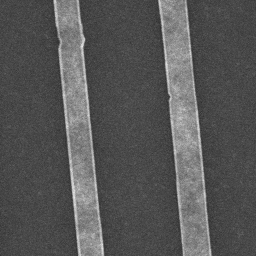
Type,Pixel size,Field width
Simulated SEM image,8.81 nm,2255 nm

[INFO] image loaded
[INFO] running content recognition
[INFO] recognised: one or a few lines or trenches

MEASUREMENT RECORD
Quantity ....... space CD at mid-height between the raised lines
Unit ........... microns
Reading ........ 0.721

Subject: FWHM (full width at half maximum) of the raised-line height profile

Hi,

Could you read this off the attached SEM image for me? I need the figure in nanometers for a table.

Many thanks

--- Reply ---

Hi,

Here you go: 214